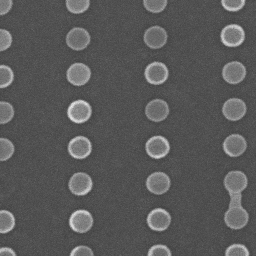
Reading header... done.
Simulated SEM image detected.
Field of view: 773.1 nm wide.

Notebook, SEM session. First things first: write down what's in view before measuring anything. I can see a regular array of raised bodies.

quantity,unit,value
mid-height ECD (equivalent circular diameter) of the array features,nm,68.4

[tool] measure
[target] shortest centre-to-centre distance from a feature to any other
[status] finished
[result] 110 nanometres